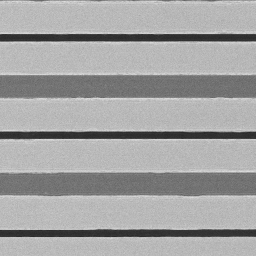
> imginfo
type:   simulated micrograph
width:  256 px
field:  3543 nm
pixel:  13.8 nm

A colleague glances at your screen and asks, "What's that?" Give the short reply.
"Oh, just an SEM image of lines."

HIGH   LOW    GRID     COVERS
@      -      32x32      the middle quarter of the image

@@@@@@@@@@@@@@@@@@@@@@@@@@@@@@@@
@@@@@@@@@@@@@@@@@@@@@@@@@@@@@@@@
@@@@@@@@@@@@@@@@@@@@@@@@@@@@@@@@
--------------------------------
--------------------------------
--------------------------------
--------------------------------
--------------------------------
--------------------------------
@@@@@@@@@@@@@@@@@@@@@@@@@@@@@@@@
@@@@@@@@@@@@@@@@@@@@@@@@@@@@@@@@
@@@@@@@@@@@@@@@@@@@@@@@@@@@@@@@@
@@@@@@@@@@@@@@@@@@@@@@@@@@@@@@@@
@@@@@@@@@@@@@@@@@@@@@@@@@@@@@@@@
@@@@@@@@@@@@@@@@@@@@@@@@@@@@@@@@
@@@@@@@@@@@@@@@@@@@@@@@@@@@@@@@@
@@@@@@@@@@@@@@@@@@@@@@@@@@@@@@@@
--------------------------------
--------------------------------
@@@@@@@@@@@@@@@@@@@@@@@@@@@@@@@@
@@@@@@@@@@@@@@@@@@@@@@@@@@@@@@@@
@@@@@@@@@@@@@@@@@@@@@@@@@@@@@@@@
@@@@@@@@@@@@@@@@@@@@@@@@@@@@@@@@
@@@@@@@@@@@@@@@@@@@@@@@@@@@@@@@@
@@@@@@@@@@@@@@@@@@@@@@@@@@@@@@@@
@@@@@@@@@@@@@@@@@@@@@@@@@@@@@@@@
@@@@@@@@@@@@@@@@@@@@@@@@@@@@@@@@
--------------------------------
--------------------------------
--------------------------------
--------------------------------
--------------------------------